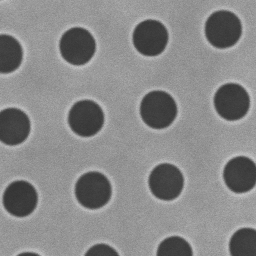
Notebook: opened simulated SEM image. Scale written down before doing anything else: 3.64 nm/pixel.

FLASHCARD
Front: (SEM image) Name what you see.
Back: a regular array of holes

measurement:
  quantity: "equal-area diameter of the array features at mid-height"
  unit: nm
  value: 133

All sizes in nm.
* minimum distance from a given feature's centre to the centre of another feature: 264